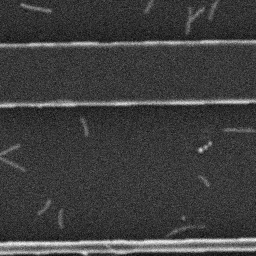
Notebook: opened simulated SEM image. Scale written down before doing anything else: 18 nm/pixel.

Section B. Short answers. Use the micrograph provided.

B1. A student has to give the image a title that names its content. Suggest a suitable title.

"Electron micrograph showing lines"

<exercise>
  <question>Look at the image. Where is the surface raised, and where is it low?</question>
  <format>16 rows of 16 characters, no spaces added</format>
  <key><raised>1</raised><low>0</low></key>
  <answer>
0000000000000000
0000000000000000
0000000000000000
1111111111111111
1111111111111111
1111111111111111
1111111110000000
0000000000000000
0000000000000000
0000000000000000
0000000000000000
0000000000000000
0000000000000000
0000000000000000
0000000000000000
1111111111111111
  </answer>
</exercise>